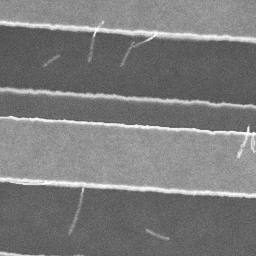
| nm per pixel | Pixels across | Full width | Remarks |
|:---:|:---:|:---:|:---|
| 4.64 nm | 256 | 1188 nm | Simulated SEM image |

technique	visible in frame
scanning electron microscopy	lines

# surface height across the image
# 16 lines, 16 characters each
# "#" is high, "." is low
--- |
################
.###############
................
................
................
................
................
###.............
################
################
################
....############
................
................
................
................